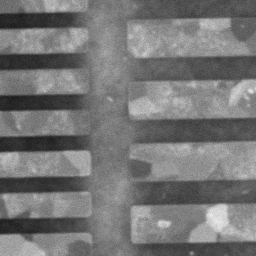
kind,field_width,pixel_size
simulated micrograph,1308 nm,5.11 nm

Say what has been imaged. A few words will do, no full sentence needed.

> groups of lines, slits or small figures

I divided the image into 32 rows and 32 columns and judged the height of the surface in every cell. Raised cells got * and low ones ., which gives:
***********.....................
******..........................
.......................*********
.........*......****************
***********.....****************
***********.....****************
***********.....****************
................................
................................
***********.....................
***********.....****************
***********.....****************
................****************
................****************
***********.....****************
***********.....................
***********.....................
................................
................****************
***********.....****************
***********.....****************
***********.....****************
.................******.........
................................
***********.....................
***********.....................
***********.....****************
................****************
................****************
***********.....****************
***********.....................
***********.....................